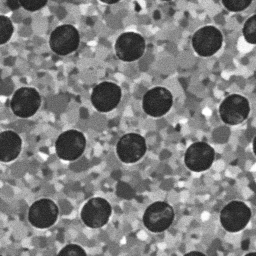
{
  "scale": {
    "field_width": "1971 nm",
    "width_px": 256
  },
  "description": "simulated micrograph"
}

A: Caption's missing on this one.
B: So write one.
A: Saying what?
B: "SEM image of a regular array of holes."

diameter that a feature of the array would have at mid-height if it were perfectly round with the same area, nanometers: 245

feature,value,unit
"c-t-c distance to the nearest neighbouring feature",452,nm